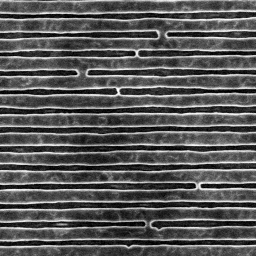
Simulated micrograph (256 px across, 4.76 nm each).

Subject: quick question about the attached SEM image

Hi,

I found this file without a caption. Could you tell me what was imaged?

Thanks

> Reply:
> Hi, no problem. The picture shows parallel lines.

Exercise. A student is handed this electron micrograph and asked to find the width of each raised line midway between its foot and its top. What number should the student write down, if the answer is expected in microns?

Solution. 0.0607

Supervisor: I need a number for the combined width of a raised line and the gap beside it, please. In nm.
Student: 90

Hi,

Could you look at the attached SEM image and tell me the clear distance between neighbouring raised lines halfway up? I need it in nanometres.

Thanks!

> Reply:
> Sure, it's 26.2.